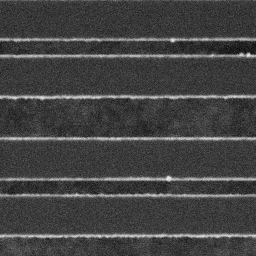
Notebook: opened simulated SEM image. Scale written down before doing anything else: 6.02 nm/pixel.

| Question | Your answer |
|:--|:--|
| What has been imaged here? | lines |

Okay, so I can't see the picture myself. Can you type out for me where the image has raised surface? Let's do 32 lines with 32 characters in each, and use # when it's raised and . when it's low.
################################
################################
################################
################################
################################
................................
................................
################################
################################
################################
################################
################################
................................
................................
................................
................................
................................
################################
################################
################################
################################
################################
....................##..........
................................
################################
################################
################################
################################
################################
#.############.####..#######....
................................
................................